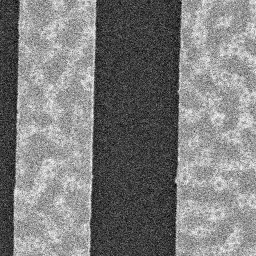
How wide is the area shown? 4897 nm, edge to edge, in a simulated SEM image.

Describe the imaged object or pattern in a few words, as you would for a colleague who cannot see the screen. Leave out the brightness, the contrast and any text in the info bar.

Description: one or a few lines or trenches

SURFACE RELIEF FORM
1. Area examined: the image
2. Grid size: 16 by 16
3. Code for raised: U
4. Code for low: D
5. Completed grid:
DUUUUUDDDDDUUUUU
DUUUUUDDDDDUUUUU
DUUUUUDDDDDUUUUU
DUUUUUDDDDDUUUUU
DUUUUUDDDDDUUUUU
DUUUUUDDDDDUUUUU
DUUUUUDDDDDUUUUU
DUUUUUDDDDDUUUUU
DUUUUUDDDDDUUUUU
DUUUUUDDDDDUUUUU
DUUUUUDDDDDUUUUU
DUUUUUDDDDDUUUUU
DUUUUUDDDDDUUUUU
DUUUUUDDDDDUUUUU
DUUUUUDDDDDUUUUU
DUUUUUDDDDDUUUUU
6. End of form